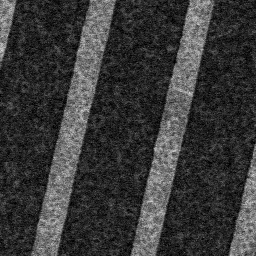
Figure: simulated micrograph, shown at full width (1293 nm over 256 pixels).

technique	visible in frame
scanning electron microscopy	one or a few lines or trenches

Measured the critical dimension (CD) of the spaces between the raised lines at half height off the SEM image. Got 72.5 pixels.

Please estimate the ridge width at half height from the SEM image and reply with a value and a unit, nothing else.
121 nanometres